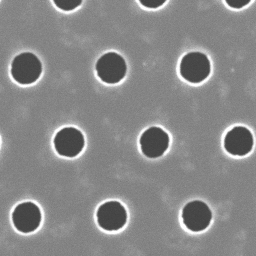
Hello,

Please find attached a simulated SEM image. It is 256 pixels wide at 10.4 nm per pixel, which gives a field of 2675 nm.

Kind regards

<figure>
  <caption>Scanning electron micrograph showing a regular array of holes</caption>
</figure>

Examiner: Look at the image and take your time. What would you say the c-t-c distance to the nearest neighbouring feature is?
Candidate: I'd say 887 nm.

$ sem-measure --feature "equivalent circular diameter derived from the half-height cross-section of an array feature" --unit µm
0.321